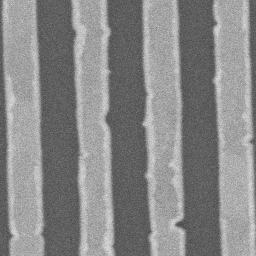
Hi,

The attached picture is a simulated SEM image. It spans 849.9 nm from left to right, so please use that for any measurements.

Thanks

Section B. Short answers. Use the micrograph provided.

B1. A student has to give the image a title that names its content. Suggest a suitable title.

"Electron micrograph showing one or a few lines or trenches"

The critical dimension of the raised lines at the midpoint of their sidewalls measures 106 nanometres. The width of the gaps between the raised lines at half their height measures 0.127 um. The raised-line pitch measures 0.234 µm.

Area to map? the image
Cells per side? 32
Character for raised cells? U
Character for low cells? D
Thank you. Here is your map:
UUUUDDDDDUUUUDDDDDUUUUDDDDDUUUUD
UUUUDDDDDUUUUDDDDDUUUUDDDDDUUUUD
UUUUDDDDDUUUUDDDDDUUUUDDDDDUUUUD
DUUUDDDDDUUUUUDDDDUUUUDDDDDUUUUD
DUUUDDDDDDUUUUDDDDUUUUDDDDDUUUUD
DUUUUDDDDUUUUDDDDDUUUUDDDDDUUUUD
DUUUUDDDDUUUUDDDDDUUUUDDDDDUUUUD
DUUUUDDDDDUUUDDDDDUUUUDDDDDUUUUD
DUUUUDDDDDUUUDDDDDUUUUDDDDDUUUUD
DUUUUDDDDDUUUDDDDDUUUUDDDDDUUUUD
DUUUUDDDDDUUUDDDDDUUUUDDDDDUUUUD
DUUUUDDDDDUUUDDDDDDUUUDDDDDUUUUD
DUUUUDDDDDUUUDDDDDUUUUUDDDDUUUUD
DUUUUDDDDDUUUDDDDDUUUUUDDDDUUUUD
DUUUUDDDDDUUUDDDDDUUUUDDDDDUUUUD
DUUUUDDDDDUUUDDDDDUUUUUDDDDUUUUD
DUUUUDDDDDUUUUDDDDDUUUUDDDDUUUUD
DUUUUDDDDDUUUUDDDDDUUUUDDDDUUUUD
DUUUUDDDDDUUUUDDDDDUUUDDDDDDUUUD
DUUUUDDDDDUUUUDDDDDUUUDDDDDDUUUD
DUUUUDDDDDUUUUDDDDDUUUUDDDDDUUUD
DUUUUDDDDDUUUUDDDDDUUUUDDDDDUUUD
DUUUUDDDDDUUUUDDDDDUUUUDDDDDUUUU
DUUUUDDDDDUUUUDDDDDUUUUDDDDDUUUU
DUUUUDDDDDUUUUDDDDDUUUUDDDDDUUUD
DUUUUDDDDDUUUUDDDDDUUUUDDDDDUUUU
DUUUUDDDDDUUUUDDDDDUUUUDDDDDUUUU
DUUUUDDDDDUUUUDDDDDUUUDDDDDDUUUU
DUUUUDDDDDUUUUDDDDDUUUDDDDDDUUUU
DDUUUDDDDDUUUUDDDDDUUUUDDDDDUUUU
DUUUUDDDDDUUUUDDDDDUUUUDDDDDUUUU
DUUUUDDDDDUUUUDDDDDUUUUDDDDDUUUU